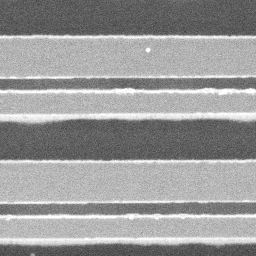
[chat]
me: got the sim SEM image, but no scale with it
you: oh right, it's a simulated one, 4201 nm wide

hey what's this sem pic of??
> lines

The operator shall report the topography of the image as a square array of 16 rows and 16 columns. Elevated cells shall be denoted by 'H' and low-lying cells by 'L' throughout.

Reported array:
LLLLLLLLLLLLLLLL
LLLLLLLLLLLLLLLL
HHHHHHHHHHHHHHHH
HHHHHHHHHHHHHHHH
HHHHHHHHHHHHHHHH
HHHHHHHHHHHHHHHH
HHHHHHHHHHHHHHHH
LLLLLLLLLLLLLLLL
LLLLLLLLLLLLLLLL
LLLLLLLLLLLLLLLL
HHHHHHHHHHHHHHHH
HHHHHHHHHHHHHHHH
HHHHHHHHHHHHHHHH
HHHHHHHHHHHHHHHH
HHHHHHHHHHHHHHHH
LLLLLLLLLLLLLLLL